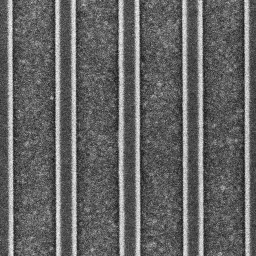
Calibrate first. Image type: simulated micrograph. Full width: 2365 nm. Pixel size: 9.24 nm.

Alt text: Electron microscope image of one or a few lines or trenches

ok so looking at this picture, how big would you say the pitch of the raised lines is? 587 nm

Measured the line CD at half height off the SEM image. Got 0.158 µm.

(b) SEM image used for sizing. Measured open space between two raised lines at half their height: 0.429 um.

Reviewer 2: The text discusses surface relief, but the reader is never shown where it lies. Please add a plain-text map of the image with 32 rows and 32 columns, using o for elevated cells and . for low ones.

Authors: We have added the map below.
o......oo......oo......oo......o
o......oo......oo......oo......o
o......oo......oo......oo......o
o......oo......oo......oo......o
o......oo......oo......oo......o
o......oo......oo......oo......o
o......oo......oo......oo......o
o......oo......oo......oo......o
o......oo......oo......oo......o
o......oo......oo......oo......o
o......oo......oo......oo......o
o......oo......oo......oo......o
o......oo......oo......oo......o
o......oo......oo......oo......o
o......oo......oo......oo......o
o......oo......oo......oo......o
o......oo......oo......oo......o
o......oo......oo......oo......o
o......oo......oo......oo......o
o......oo......oo......oo......o
o......oo......oo......oo......o
o......oo......oo......oo......o
o......oo......oo......oo......o
o......oo......oo......oo......o
o......oo......oo......oo......o
o......oo......oo......oo......o
o......oo......oo......oo......o
o......oo......oo......oo......o
o......oo......oo......oo......o
o......oo......oo......oo......o
o......oo......oo......oo......o
o......oo......oo......oo......o